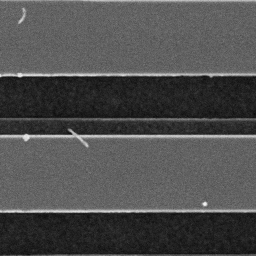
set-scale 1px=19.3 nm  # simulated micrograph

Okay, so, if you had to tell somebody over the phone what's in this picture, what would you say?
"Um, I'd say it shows lines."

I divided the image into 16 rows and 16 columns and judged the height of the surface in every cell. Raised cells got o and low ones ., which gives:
oooooooooooooooo
oooooooooooooooo
oooooooooooooooo
oooooooooooooooo
oooooooooooooooo
................
................
................
oooooooooooooooo
oooooooooooooooo
oooooooooooooooo
oooooooooooooooo
oooooooooooooooo
................
................
................